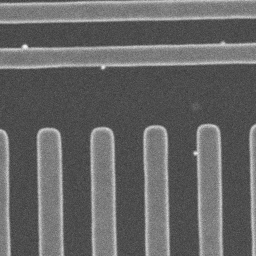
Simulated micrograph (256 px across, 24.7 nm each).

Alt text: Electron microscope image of groups of lines, slits or small figures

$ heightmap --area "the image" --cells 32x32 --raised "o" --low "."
..oooooooooooooooooooooooooooooo
oooooooooooooooooooooooooooooooo
oooooooooooooooo................
................................
................................
...........................oo..o
oooooooooooooooooooooooooooooooo
oooooooooooooooooooooooooooooooo
................................
................................
................................
................................
................................
................................
................................
................................
o....oo.....oo....ooo....oo....o
o....ooo...ooo....ooo....oo....o
o....ooo...ooo....ooo....ooo...o
o....ooo...ooo....ooo....ooo...o
o....ooo...ooo....ooo....ooo...o
o....ooo...ooo....ooo....ooo...o
o....ooo....oo....ooo....ooo...o
o....ooo....oo....ooo....ooo...o
o....ooo....oo....ooo....ooo...o
o....ooo....oo....ooo....ooo....
o....ooo....oo....ooo....ooo....
o....ooo....oo....ooo....ooo....
o....ooo....oo....ooo....ooo....
o....ooo....oo....ooo....ooo....
o....ooo....oo....ooo....ooo....
o....ooo....oo....ooo....ooo....